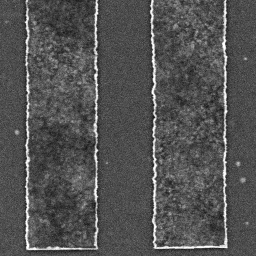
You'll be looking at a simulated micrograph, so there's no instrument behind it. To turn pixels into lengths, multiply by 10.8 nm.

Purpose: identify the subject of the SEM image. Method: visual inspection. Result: one or a few lines or trenches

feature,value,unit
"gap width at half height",614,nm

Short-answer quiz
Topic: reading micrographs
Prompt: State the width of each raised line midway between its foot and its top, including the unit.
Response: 760 nanometres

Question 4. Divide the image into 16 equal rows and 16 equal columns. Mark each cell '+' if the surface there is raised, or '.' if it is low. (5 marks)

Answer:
..++++...+++++..
..++++...+++++..
..++++...+++++..
..++++....++++..
..++++....++++..
..++++....++++..
..++++....++++..
..++++....++++..
..++++....++++..
..++++....++++..
..++++....++++..
..++++....++++..
..++++....++++..
..++++....++++..
..++++....++++..
..++++..........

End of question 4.